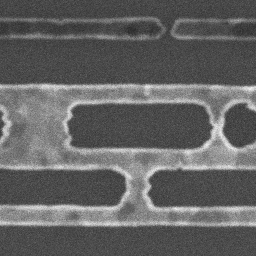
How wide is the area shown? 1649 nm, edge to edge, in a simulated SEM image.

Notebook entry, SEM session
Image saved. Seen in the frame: one or a few lines or trenches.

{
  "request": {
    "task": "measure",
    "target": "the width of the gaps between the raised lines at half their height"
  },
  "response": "0.307 micrometres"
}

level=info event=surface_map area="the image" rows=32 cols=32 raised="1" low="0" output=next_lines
00000000000000000000000000000000
00000000000000000000000000000000
11101100000000011111000000000000
11111111111111111111001111111111
11111111111011111111001111111111
00000000000000000000000000000000
00000000000000000000000000000000
00000000000000000000000000000000
00000000000000000000000000000000
00000000000000000000000000000000
00000000000000000000000000000000
11111111111111111111111111111111
11111111111111111111111111111111
11111111100000000000000000110000
01111111100000000000000000110000
01111111000000000000000000010000
01111111000000000000000000010000
11111111100000000000000000110000
11111111100000000000000001111001
11111111111111111111111111111111
11111111111111111111111111111111
00000000000000011110000000000000
00000000000000001100000000000000
00000000000000001110000000000000
00000000000000001100000000000000
00000000000000011110000000000000
11111111111111111111111111111111
11111111111111111111111111111111
00000000000000000000000000000000
00000000000000000000000000000000
00000000000000000000000000000000
00000000000000000000000000000000